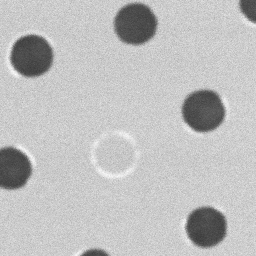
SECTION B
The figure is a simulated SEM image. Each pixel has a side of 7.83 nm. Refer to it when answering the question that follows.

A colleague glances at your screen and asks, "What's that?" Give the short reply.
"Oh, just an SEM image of holes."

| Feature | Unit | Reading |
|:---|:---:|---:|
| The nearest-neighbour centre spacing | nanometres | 858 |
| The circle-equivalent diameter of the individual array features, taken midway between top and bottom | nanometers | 341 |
